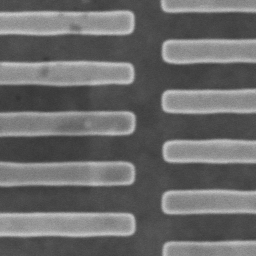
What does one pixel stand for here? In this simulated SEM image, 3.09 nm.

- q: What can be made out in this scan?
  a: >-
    wiring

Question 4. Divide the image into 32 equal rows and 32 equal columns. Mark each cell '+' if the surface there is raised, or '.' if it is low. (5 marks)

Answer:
....................++++++++++++
..............++.....++.........
+++++++++++++++++...............
+++++++++++++++++...............
................................
....................++++++++++++
....................++++++++++++
.....................+++++++++++
+++++++++++++++++...............
+++++++++++++++++...............
.....+++++++....................
.....................+++++++++++
....................++++++++++++
....................++++++++++++
+++++++++++++++++...............
+++++++++++++++++...............
++++++++++++++++................
..........................+++...
....................++++++++++++
....................++++++++++++
++++++++++++++++................
+++++++++++++++++...............
+++++++++++++++++...............
................................
....................++++++++++++
....................++++++++++++
.....................+++++++++++
+++++++++++++++++...............
+++++++++++++++++...............
..++....+++.....................
.....................+++++++++++
....................++++++++++++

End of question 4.